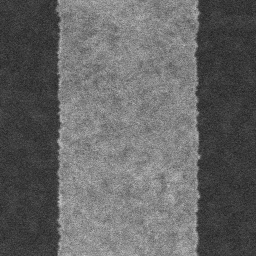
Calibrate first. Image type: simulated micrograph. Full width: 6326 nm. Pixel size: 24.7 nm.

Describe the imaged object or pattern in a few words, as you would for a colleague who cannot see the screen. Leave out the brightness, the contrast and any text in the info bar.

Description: one or a few lines or trenches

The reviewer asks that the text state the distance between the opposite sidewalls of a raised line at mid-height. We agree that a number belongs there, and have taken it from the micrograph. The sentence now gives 3.38 um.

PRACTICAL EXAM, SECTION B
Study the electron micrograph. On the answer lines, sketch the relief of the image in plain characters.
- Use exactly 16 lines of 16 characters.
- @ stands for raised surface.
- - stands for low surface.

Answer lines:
----@@@@@@@@----
----@@@@@@@@----
----@@@@@@@@----
----@@@@@@@@----
----@@@@@@@@----
----@@@@@@@@----
----@@@@@@@@----
----@@@@@@@@----
----@@@@@@@@----
----@@@@@@@@----
----@@@@@@@@----
----@@@@@@@@----
----@@@@@@@@----
----@@@@@@@@----
----@@@@@@@@----
----@@@@@@@@----